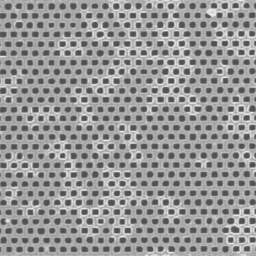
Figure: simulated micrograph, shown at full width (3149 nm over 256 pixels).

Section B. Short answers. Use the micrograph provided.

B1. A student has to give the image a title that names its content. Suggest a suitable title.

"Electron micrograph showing a regular array of holes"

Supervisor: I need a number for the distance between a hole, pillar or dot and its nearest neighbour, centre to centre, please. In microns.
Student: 0.127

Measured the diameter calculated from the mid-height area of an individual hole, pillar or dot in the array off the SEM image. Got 86.7 nm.